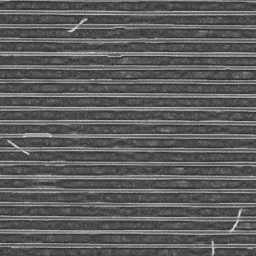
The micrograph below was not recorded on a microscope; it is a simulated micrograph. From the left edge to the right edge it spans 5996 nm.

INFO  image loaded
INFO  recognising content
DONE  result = parallel lines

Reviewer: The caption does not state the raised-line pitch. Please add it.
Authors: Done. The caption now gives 321 nm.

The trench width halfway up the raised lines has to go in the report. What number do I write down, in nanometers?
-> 246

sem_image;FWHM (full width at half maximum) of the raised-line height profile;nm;82